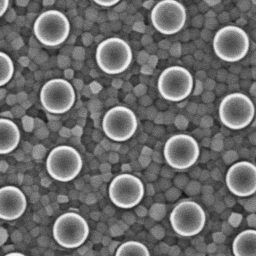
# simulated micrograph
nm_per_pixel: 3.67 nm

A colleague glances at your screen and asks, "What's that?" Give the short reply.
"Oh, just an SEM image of a regular array of raised bodies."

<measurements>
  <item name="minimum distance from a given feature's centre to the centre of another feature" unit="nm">247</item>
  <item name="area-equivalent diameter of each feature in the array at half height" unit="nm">124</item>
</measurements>